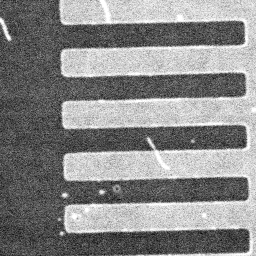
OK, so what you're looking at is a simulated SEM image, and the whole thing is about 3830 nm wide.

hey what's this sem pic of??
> groups of lines, slits or small figures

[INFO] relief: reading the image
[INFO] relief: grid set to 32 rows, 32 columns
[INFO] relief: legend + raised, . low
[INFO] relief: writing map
........++++++++++++++++++++++++
........++++++++++++++++++++++++
........+++++++++++++++++++...++
...............................+
...............................+
...............................+
........++++++++++++++++++++++++
........++++++++++++++++++++++++
........++++++++++++++++++++++++
...............................+
...............................+
...............................+
.....................+++++++++++
........++++++++++++++++++++++++
........++++++++++++++++++++++++
........++++++++++++++++++....++
...............................+
...............................+
...............................+
........++++++++++++++++++++++++
........++++++++++++++++++++++++
........++++++++++++++++++++++++
...............................+
...............................+
...............................+
.......................+++++++++
........++++++++++++++++++++++++
........++++++++++++++++++++++++
........++++++++++++++++++++..++
...............................+
...............................+
...............................+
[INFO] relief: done